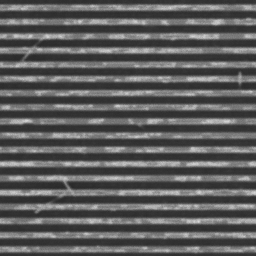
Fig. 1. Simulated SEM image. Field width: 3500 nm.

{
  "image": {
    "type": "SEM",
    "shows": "parallel lines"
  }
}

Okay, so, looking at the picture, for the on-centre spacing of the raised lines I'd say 194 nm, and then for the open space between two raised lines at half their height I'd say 0.102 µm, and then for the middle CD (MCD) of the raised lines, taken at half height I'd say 0.0888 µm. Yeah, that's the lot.